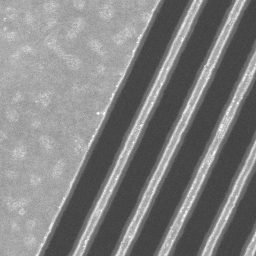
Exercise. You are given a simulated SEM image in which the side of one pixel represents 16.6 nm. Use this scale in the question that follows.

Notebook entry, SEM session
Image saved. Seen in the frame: parallel lines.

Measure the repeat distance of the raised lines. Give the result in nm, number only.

642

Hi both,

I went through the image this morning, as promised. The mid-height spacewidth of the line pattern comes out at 470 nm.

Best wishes